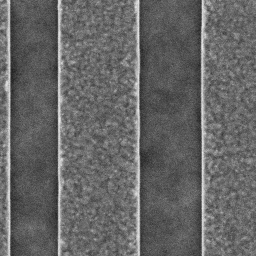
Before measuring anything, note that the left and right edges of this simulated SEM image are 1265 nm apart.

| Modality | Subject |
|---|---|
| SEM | wiring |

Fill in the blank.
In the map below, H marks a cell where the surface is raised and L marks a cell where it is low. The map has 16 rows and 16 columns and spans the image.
HLLLHHHHHLLLLHHH
HLLLHHHHHLLLLHHH
HLLLHHHHHLLLLHHH
HLLLHHHHHLLLLHHH
HLLLHHHHHLLLLHHH
HLLLHHHHHLLLLHHH
HLLLHHHHHLLLLHHH
HLLLHHHHHLLLLHHH
HLLLHHHHHLLLLHHH
HLLLHHHHHLLLLHHH
HLLLHHHHHLLLLHHH
HLLLHHHHHLLLLHHH
HLLLHHHHHLLLLHHH
HLLLHHHHHLLLLHHH
HLLLHHHHHLLLLHHH
HLLLHHHHHLLLLHHH